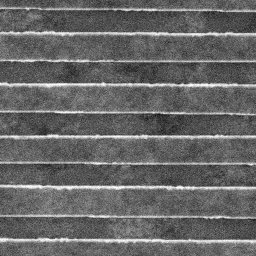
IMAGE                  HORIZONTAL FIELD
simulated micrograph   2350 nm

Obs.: lines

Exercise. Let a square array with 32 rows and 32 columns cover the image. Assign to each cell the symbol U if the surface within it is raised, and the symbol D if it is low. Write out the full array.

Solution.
UUUUUUUUUUUUUUUUUUUUUUUUUUUUUUUU
DDDDDDDDDDDDDDDDDDDDDDDDDDDDDDDD
DDDDDDDDDDDDDDDDDDDDDDDDDDDDDDDD
DDDDDDDDDDDDDDDDDDDDDDDDDDDDDDDD
UUUUUUUUUUUUUUUUUUUUUUUUUUUUUUUU
UUUUUUUUUUUUUUUUUUUUUUUUUUUUUUUU
UUUUUUUUUUUUUUUUUUUUUUUUUUUUUUUU
UUUUUUUUUUUUUUUUUUUUUUUUUUUUUUUU
DDDDDDDDDDDDDDDDDDDDDDDDDDDDDDDD
DDDDDDDDDDDDDDDDDDDDDDDDDDDDDDDD
DDDDDDDDDDDDDDDDDDDDDDDDDDDDDDDD
UUUUUUUUUUUUUUUUUUUUUUUUUUUUUUUU
UUUUUUUUUUUUUUUUUUUUUUUUUUUUUUUU
UUUUUUUUUUUUUUUUUUUUUUUUUUUUUUUU
DDDDDDDDDDDDDDDDDDDDDDDDDDDDDDDD
DDDDDDDDDDDDDDDDDDDDDDDDDDDDDDDD
DDDDDDDDDDDDDDDDDDDDDDDDDDDDDDDD
UUUUUUUUUUUUUUUUUUUUUUUUUUUUUUUU
UUUUUUUUUUUUUUUUUUUUUUUUUUUUUUUU
UUUUUUUUUUUUUUUUUUUUUUUUUUUUUUUU
DDDDDDDDDDDDDDDDDDDDDDDDDDDDDDDU
DDDDDDDDDDDDDDDDDDDDDDDDDDDDDDDD
DDDDDDDDDDDDDDDDDDDDDDDDDDDDDDDD
UUUUUUUUUUUUUUUUUUUUUUUUUUUUUUUU
UUUUUUUUUUUUUUUUUUUUUUUUUUUUUUUU
UUUUUUUUUUUUUUUUUUUUUUUUUUUUUUUU
UUUUUUUUUUUUUUUUUUUUUUUUUUUUUUUU
DDDDDDDDDDDDDDDDDDDDDDDDDDDDDDDD
DDDDDDDDDDDDDDDDDDDDDDDDDDDDDDDD
DDDDDDDDDDDDDDDDDDDDDDDDDDDDDDDD
UUUUUUUUUUUUUUUUUUUUUUUUUUUUUUUU
UUUUUUUUUUUUUUUUUUUUUUUUUUUUUUUU